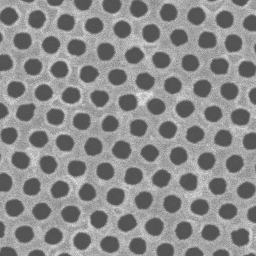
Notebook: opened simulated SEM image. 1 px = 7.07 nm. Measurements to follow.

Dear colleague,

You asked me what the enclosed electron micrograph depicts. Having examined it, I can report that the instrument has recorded a regular array of holes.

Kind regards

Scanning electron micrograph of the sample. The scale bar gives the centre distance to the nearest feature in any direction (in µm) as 0.19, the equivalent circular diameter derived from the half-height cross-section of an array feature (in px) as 17.6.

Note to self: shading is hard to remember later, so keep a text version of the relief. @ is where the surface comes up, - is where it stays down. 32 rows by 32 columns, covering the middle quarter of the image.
-@@@@--@@@@@@@@@@@@@@@@---@@@---
-@@@----@@@@---@@@@@@@@@@@@@@@--
-@@@-----@@----@@@@--@@@@@@@@@@@
@@@@----@@@-----@@-----@@@--@@@@
@@@@@--@@@@@---@@@-----@@----@@@
@@@@@@@@@@@@@@@@@@----@@@----@@@
----@@@@@@@@@@@@@@@@-@@@@----@@@
----@@@----@@@@@-@@@@@@@@@@-@@@@
----@@@----@@@----@@@@@@@@@@@@@@
@--@@@@----@@@----@@@----@@@@---
@@@@@@@@--@@@@----@@@----@@@----
@@@@@@@@@@@@@@@--@@@@----@@@----
@@@---@@@@@@@@@@@@@@@@--@@@@----
@@-----@@@---@@@@@@@@@@@@@@@@@@@
@@-----@@@----@@@---@@@@@--@@@@@
@@@---@@@-----@@-----@@@----@@@@
@@@@-@@@@@---@@@@----@@@----@@@-
@@@@@@@@@@@@@@@@@---@@@@----@@@-
--@@@@--@@@@@@@@@@@@@@@@@--@@@@-
--@@@@---@@@@---@@@@@@@@@@@@@@@@
--@@@-----@@-----@@@--@@@@@@@@@@
--@@@----@@@-----@@----@@@@---@@
@@@@@@---@@@----@@@-----@@-----@
@@@@@@@@@@@@@@--@@@@---@@@-----@
@@---@@@@@@@@@@@@@@@@@@@@@@---@@
@-----@@----@@@@@@@@@@@@@@@@@@@@
@----@@@-----@@@---@@@@@-@@@@@@@
@@---@@@-----@@-----@@@----@@@--
@@@@@@@@@---@@@-----@@-----@@---
@@@@@@@@@@@@@@@----@@@----@@@---
-@@@@--@@@@@@@@@@@@@@@@--@@@@---
-@@@----@@@----@@@@@@@@@@@@@@@--